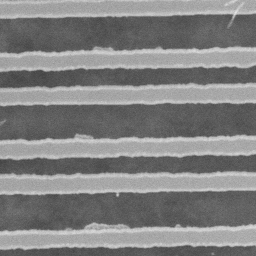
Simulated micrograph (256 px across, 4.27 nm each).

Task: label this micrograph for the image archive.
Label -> lines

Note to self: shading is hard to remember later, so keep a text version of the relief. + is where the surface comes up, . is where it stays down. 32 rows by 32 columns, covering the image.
++++++++++++++++++++++++++++++++
++++++++++++++++++++++++++++++++
................................
................................
................................
................................
...........+....++++++++++++++++
++++++++++++++++++++++++++++++++
+++++++++++++++.++.+............
................................
................................
++++++++++++++++++++++++++++++++
++++++++++++++++++++++++++++++++
................................
................................
................................
................................
.........++....+++++++++++++++++
++++++++++++++++++++++++++++++++
+++++++++++++++++++++++.........
................................
................................
++++++++++++++++++++++++++++++++
++++++++++++++++++++++++++++++++
................................
................................
................................
................................
...........................+..++
++++++++++++++++++++++++++++++++
++++++++++++++++++++++++++++++++
................................